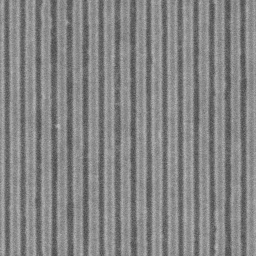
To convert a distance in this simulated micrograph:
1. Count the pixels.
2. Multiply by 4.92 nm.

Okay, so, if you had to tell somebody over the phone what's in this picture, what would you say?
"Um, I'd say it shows parallel lines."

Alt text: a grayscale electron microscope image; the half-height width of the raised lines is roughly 39.3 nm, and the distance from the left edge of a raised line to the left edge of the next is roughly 77.5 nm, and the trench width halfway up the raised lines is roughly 38.7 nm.